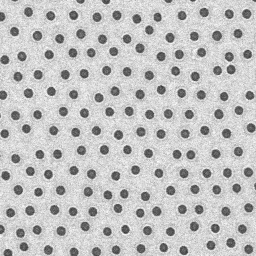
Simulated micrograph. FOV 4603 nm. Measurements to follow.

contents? a regular array of holes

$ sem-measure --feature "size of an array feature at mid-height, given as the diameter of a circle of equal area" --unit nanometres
174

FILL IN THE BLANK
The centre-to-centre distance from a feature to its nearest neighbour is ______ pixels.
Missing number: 18.8